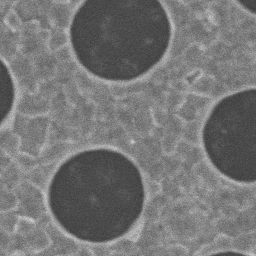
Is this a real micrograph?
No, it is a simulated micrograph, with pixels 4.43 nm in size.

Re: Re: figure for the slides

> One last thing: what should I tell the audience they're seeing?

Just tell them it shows holes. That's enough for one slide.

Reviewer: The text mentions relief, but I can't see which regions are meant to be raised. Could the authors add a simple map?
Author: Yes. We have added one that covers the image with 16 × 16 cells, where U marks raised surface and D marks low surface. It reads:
UUUUUDDDDDUUUUUD
UUUUDDDDDDDUUUUU
UUUUDDDDDDDUUUUU
UUUUUDDDDDUUUUUU
DUUUUUDDDUUUUUUU
DUUUUUUUUUUUUUUU
DUUUUUUUUUUUUUDD
UUUUUUUUUUUUUDDD
UUUUUUUUUUUUUDDD
UUUUUDDUUUUUUDDD
UUUUDDDDDUUUUUDD
UUUDDDDDDUUUUUUU
UUUDDDDDDUUUUUUU
UUUDDDDDDUUUUUUU
UUUUDDDDUUUUUUUU
UUUUUUUUUUUUUUUU